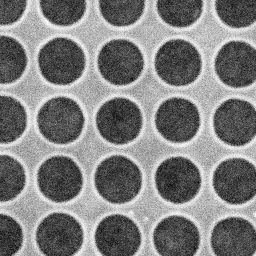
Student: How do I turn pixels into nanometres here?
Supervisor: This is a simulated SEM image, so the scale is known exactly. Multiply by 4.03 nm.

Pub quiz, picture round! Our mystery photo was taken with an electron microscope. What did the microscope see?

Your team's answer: a regular array of holes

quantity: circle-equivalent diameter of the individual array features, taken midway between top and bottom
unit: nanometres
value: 193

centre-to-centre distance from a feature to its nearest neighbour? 235 nm